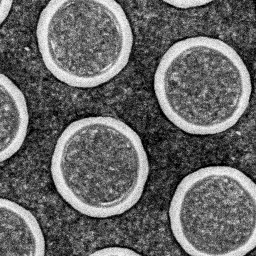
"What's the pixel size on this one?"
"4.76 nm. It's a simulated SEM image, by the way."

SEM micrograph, raised bodies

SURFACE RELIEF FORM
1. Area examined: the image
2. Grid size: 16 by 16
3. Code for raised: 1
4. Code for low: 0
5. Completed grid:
0001111000000000
0001111100000000
0001111100000000
0001111100011110
0000111000111110
1000000000111110
1000000000111110
1100000000011110
1000111100000000
1000111110000000
0001111110000000
0000111110001111
0000011100011111
1100000000011111
1100000000011111
1100000000001110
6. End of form